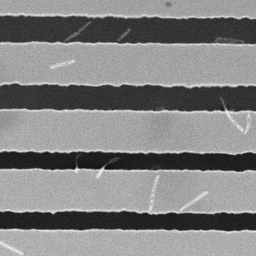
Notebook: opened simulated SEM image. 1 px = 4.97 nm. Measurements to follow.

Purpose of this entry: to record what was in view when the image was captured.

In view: lines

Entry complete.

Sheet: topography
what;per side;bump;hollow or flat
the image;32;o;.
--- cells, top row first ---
oooooooooooooooooooooooooooooooo
oooooooooooooooooooooooooooooooo
................................
................................
................................
oooooooooooooooooooo.......o....
oooooooooooooooooooooooooooooooo
oooooooooooooooooooooooooooooooo
oooooooooooooooooooooooooooooooo
oooooooooooooooooooooooooooooooo
oooooooooooooooooooooooooooooooo
................................
................................
................................
oooooooooooooooooooooooooooooooo
oooooooooooooooooooooooooooooooo
oooooooooooooooooooooooooooooooo
oooooooooooooooooooooooooooooooo
oooooooooooooooooooooooooooooooo
................................
................................
oooooooooooooooooooooooooooooooo
oooooooooooooooooooooooooooooooo
oooooooooooooooooooooooooooooooo
oooooooooooooooooooooooooooooooo
oooooooooooooooooooooooooooooooo
..ooooo......oo..ooooooooooooooo
................................
................................
oooooooooooooooooooooooooooooooo
oooooooooooooooooooooooooooooooo
oooooooooooooooooooooooooooooooo